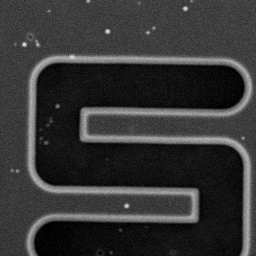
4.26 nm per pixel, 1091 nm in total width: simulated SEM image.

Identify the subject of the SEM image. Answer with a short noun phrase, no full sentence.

groups of lines, slits or small figures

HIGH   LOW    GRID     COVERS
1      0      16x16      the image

1111111111111111
1111111111111111
1111111111111111
1111111111111111
1100000000000001
1100000000000001
1100000000000001
1100011111111111
1100011111111111
1100000000000001
1100000000000001
1110000000000001
1111111111110001
1111111111110001
1100000000000001
1100000000000001